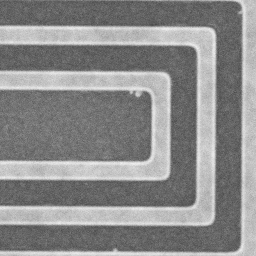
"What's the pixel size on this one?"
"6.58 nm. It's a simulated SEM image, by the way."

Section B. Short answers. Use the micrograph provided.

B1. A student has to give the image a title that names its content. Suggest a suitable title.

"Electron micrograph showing groups of lines, slits or small figures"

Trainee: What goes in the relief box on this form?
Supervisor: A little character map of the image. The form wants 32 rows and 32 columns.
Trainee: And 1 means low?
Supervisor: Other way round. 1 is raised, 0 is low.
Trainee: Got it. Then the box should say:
00000000000000000000000000000011
00000000000000000000000000000011
00000000000000000000000000000001
11111111111111111111111111000011
11111111111111111111111111100011
00000000111111111111111111100011
00000000000000000000000001100011
00000000000000000000000001100011
00000000000000000000000001100011
11111111111111111111100001100011
11111111111111111111100001100011
00000000000000000001100001100011
00000000000000000001100001100011
00000000000000000001100001100011
00000000000000000001100001100011
00000000000000000001100001100011
00000000000000000001100001100011
00000000000000000001100001100011
00000000000000000001100001100011
00000000000000000001100001100011
11111111111111111111100001100011
11111111111111111111100001100011
00000000000000000000000001100011
00000000000000000000000001100011
00000000000000000000000001100011
00000000000000000000000011100011
11111111111111111111111111100011
11111111111111111111111111100011
00000000000000000000000000000011
00000000000000000000000000000011
00000000000000000000000000000011
00000000000000000000000000000011